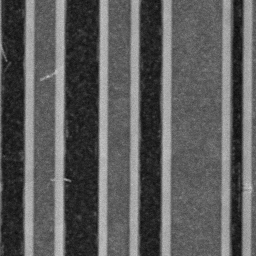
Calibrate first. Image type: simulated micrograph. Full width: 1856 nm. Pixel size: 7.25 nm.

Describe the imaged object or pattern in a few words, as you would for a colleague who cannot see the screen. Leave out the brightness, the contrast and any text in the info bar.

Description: one or a few lines or trenches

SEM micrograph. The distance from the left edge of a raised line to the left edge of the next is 551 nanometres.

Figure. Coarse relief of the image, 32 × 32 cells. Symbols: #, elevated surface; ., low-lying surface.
....####.....####....#######...#
....####.....####....#######...#
....####.....####....#######...#
....####.....####....#######...#
....####.....####....#######...#
....####.....####....#######...#
....####.....####....#######...#
....####.....####....#######...#
....####.....####....#######...#
....####.....####....#######...#
....###......####....#######...#
....###......####....#######...#
....###......####....#######...#
....###......####....#######...#
....###......####....#######...#
....###......####....#######...#
....###......####....#######...#
....###......####....#######...#
....###......####....#######...#
....###......####....#######...#
....###......####....#######...#
....###......####....#######...#
....####.....####....#######...#
....###......####....#######...#
....###......####....#######...#
....###......####....#######...#
....###......####....#######...#
....###......####....#######...#
....###......####....#######...#
....###......####....#######...#
....###......####....#######...#
....###......####....#######...#